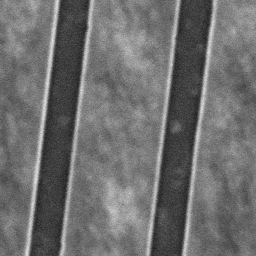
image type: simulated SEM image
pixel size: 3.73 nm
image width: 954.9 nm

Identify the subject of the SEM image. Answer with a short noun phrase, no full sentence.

one or a few lines or trenches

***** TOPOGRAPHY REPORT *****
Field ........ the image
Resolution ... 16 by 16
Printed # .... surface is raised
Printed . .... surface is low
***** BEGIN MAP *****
####..#####..###
###...#####..###
###..######..###
###..######..###
###..######..###
###..######..###
###..#####...###
###..#####..####
###..#####..####
###..#####..####
##..######..####
##..######..####
##..######..####
##..######..####
##..#####...####
##..#####...####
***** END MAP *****